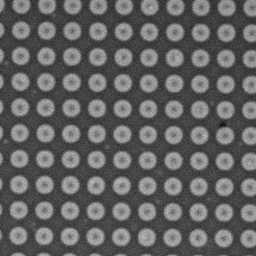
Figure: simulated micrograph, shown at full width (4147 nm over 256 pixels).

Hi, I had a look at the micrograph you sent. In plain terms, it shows an array of small figures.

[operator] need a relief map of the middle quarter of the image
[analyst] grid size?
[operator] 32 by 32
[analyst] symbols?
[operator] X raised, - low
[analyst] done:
--------------------------------
--------------------------------
--------------------------------
XXXX---XXX---XXX----XXX---XXX---
XXXX--XXXX---XXXX--XXXX---XXXX--
XXXX--XXXX---XXXX--XXXX---XXXX--
-XX----XX-----XX----XX----XXX---
--------------------------------
--------------------------------
XXX----XXX---XXX----XX-----X----
XXXX--XXXX---XXXX--XXXX---XXX---
XXXX--XXXX---XXXX--XXXX--XXXXX--
XXX----XXX---XXX---XXXX---XXX---
--------------------------------
--------------------------------
-X------------------------------
XXXX--XXXX---XXX---XXXX---XXX---
XXXX--XXXX---XXXX--XXXX--XXXX---
XXXX--XXXX---XXX---XXXX---XXX---
-------XX-----X-----XX----XXX---
--------------------------------
--------------------------------
XXX----XXX---XXX----XX----XXX---
XXXX--XXXX---XXXX--XXXX--XXXX---
XXXX--XXXX---XXXX--XXXX--XXXX---
XXX----XXX---XXX---XXXX---XXX---
--------------------------------
--------------------------------
XXX----XX-----X-----X-----------
XXXX--XXXX---XXX---XXXX---XXX---
XXXX--XXXX--XXXX---XXXX--XXXX---
XXX---XXXX---XXX---XXXX--XXXX---